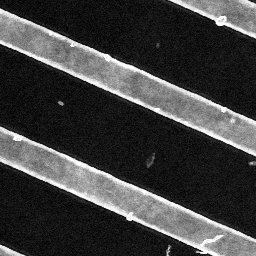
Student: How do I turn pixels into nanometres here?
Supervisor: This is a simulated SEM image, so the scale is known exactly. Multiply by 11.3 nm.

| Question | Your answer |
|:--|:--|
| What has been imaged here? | lines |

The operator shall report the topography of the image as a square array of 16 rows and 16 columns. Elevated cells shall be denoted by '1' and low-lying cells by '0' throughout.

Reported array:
0000000000001111
1100000000000011
1111000000000000
0011111000000000
0000111110000000
0000001111100000
0000000001111100
0000000000011111
1000000000000111
1111000000000001
0111110000000000
0001111100000000
0000001111000000
0000000011111000
0000000000111110
0000000000001111